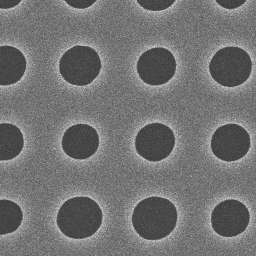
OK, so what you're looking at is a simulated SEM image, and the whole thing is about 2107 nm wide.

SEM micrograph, a regular array of holes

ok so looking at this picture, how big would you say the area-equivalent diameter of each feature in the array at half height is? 324 nanometers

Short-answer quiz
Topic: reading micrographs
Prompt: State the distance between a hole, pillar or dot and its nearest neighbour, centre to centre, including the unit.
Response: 0.618 microns